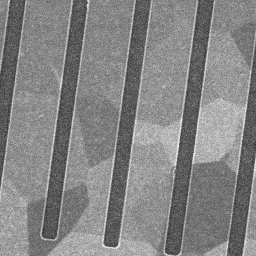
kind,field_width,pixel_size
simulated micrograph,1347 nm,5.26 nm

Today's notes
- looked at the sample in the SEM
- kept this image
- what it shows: one or a few lines or trenches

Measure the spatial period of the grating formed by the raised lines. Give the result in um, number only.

0.327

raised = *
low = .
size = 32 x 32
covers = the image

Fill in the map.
*..******..******..******..*****
*..******..******..*****...*****
*..******..******..*****..******
*..******..*****...*****..******
*..*****..******..******..******
*.******..******..******..******
..******..******..******..******
..******..******..******..******
..******..******..******..*****.
..******..******..*****...*****.
..******..******..*****..******.
..******..*****..******..******.
..*****..******..******..******.
.******..******..******..******.
.******..******..******..******.
.******..******..******..******.
.******..******..*****...*****..
.******..******..*****..******..
.******..******.******..******..
.*****..******..******..******..
******..******..******..******..
******..******..******..******..
******..******..******..******..
******..******..******..*****..*
******..******..******..*****..*
******..******..*****..******..*
******.******..******..******..*
*****..******..******..******..*
*****..******..******..******..*
*****..******..******..******..*
*************..******..******..*
*********************..*****..**